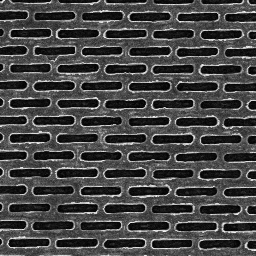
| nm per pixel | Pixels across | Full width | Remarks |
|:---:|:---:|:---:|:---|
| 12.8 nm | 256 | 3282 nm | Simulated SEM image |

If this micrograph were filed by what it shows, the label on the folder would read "a regular array of holes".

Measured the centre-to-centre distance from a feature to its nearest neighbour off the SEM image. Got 371 nm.